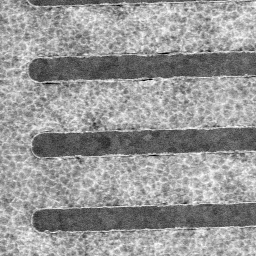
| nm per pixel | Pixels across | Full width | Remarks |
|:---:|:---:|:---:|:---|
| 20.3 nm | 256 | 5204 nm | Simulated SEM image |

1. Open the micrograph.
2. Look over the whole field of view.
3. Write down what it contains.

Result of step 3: one or a few lines or trenches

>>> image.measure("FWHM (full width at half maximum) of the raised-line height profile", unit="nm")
510